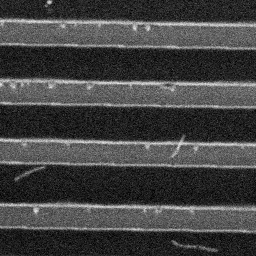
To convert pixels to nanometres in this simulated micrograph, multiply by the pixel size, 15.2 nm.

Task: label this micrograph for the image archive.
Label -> lines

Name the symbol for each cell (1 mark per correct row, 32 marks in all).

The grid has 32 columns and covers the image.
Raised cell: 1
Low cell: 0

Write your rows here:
11111111111111111111111111111111
11111111111111111111111111111111
11111111111111111111111111111111
00000000000000000000000000000000
00000000000000000000000000000000
00000000000000000000000000000000
11111111111111111111111111111111
11111111111111111111111111111111
11111111111111111111111111111111
11111111111111111111111111111111
00000000000000000000000001111111
00000000000000000000000000000000
00000000000000000000000000000000
11111111111111111111111111111111
11111111111111111111111111111111
11111111111111111111111111111111
11111111111111111111111111111111
11111111111111111111111111111111
00000000000000000000000000000000
00000000000000000000000000000000
11111111100000000000000000000000
11111111111111111111111111111111
11111111111111111111111111111111
11111111111111111111111111111111
11111111111111111111111111111111
11111111111111111111111111111111
00000000000000000000000000000000
00000000000000000000000000000000
11110000000000000000000000000000
11111111111111111111111111111111
11111111111111111111111111111111
11111111111111111111111111111111